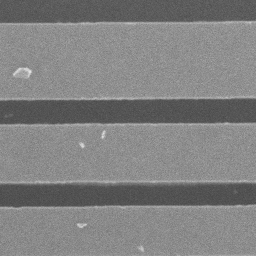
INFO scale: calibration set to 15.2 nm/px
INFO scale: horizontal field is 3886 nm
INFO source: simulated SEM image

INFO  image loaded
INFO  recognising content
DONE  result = lines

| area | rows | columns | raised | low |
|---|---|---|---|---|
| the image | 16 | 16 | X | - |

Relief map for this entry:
----------------
XXXXXXXXXXXXXXXX
XXXXXXXXXXXXXXXX
XXXXXXXXXXXXXXXX
XXXXXXXXXXXXXXXX
XXXXXXXXXXXXXXXX
----------------
----------------
XXXXXXXXXXXXXXXX
XXXXXXXXXXXXXXXX
XXXXXXXXXXXXXXXX
----------------
----------------
XXXXXXXXXXXXXXXX
XXXXXXXXXXXXXXXX
XXXXXXXXXXXXXXXX